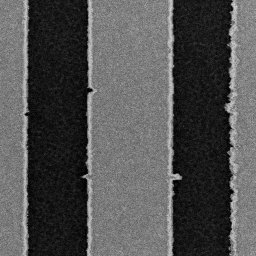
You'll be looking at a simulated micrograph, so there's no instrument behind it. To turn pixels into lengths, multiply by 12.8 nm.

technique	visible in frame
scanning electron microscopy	one or a few lines or trenches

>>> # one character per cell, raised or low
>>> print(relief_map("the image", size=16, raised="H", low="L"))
HHLLLLHHHHHLLLLH
HHLLLLHHHHHLLLLH
HHLLLLHHHHHLLLLH
HHLLLLHHHHHLLLLH
HHLLLLHHHHHLLLLH
HHLLLLHHHHHLLLLH
HHLLLLHHHHHLLLHH
HHLLLLHHHHHLLLLH
HHLLLLHHHHHLLLLH
HHLLLLHHHHHLLLLH
HHLLLLHHHHHLLLLH
HHLLLLHHHHHLLLLH
HHLLLLHHHHHLLLLH
HHLLLLHHHHHLLLLH
HHLLLLHHHHHLLLLH
HHLLLLHHHHHLLLLH